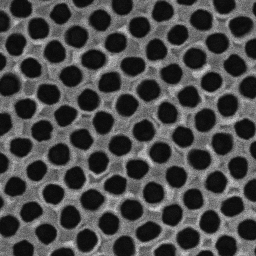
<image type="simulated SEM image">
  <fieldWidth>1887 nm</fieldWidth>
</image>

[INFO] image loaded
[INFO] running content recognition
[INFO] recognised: a regular array of holes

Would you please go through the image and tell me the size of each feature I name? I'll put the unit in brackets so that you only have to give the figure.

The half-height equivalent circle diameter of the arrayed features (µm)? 0.158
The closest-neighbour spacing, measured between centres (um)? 0.199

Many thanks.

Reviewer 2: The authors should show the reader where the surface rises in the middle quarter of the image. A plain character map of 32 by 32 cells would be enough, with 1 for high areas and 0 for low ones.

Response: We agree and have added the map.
10011000001111000000111111000110
00001111111111100000111100000111
00001111110000110001111110000011
00001111100000111111111110000111
00001111100000111110000110000111
10011111100000111100000011111111
11111001100001111100000011111000
11110000111111111100000011110000
11100000011111000010000111110000
11100000111110000001111110111000
01110000111110000001111100001100
00011001111110000011111100001111
00011111000011000111111100001111
00011110000011111111111100001111
00111110000011111110011100001111
01111110000011111000001111111111
11110011000111111000001111110000
11000011101111111000000111100000
10000001111100001100001111100000
11000001111100000111111111110000
01100001111000000111110000111001
01111111111000000111110000011111
01111110001100011111100000011110
01111100000111111111110000111110
01111100000111110000111001111111
11111100000111110000011111111111
10000110001111110000011111000011
00000111111111110000111110000001
00000111111100011001111110000001
00000111110000001111111111000011
10000111110000001111000011100011
11111100110000011111000001111110